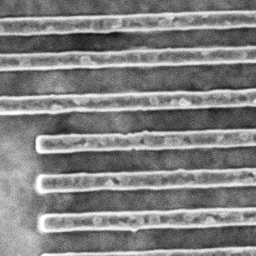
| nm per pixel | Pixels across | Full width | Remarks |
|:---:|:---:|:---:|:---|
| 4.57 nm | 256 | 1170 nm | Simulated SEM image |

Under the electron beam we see parallel lines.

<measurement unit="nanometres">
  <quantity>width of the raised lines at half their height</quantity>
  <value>70.7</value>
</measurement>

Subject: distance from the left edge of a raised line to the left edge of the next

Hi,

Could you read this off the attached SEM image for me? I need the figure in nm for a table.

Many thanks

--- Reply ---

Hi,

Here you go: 180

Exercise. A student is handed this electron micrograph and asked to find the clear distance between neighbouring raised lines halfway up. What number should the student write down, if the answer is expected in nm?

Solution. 108